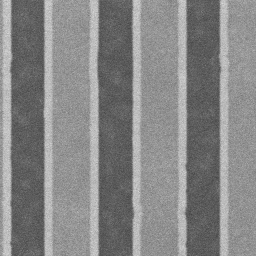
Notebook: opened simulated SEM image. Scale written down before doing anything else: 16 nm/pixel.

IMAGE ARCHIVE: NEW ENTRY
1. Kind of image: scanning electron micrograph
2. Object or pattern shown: one or a few lines or trenches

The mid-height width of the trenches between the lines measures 0.653 micrometres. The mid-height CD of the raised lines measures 0.745 µm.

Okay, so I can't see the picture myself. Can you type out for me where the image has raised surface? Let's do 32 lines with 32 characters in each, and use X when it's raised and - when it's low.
X-----XXXXXX-----XXXXXX-----XXXX
X-----XXXXXX-----XXXXXX-----XXXX
X-----XXXXXX-----XXXXXX-----XXXX
X-----XXXXXX-----XXXXXX-----XXXX
X-----XXXXXX-----XXXXXX-----XXXX
X-----XXXXXX-----XXXXXX-----XXXX
X-----XXXXXX-----XXXXXX-----XXXX
X-----XXXXXX-----XXXXXX-----XXXX
X-----XXXXXX-----XXXXXX-----XXXX
X-----XXXXXX-----XXXXXX-----XXXX
X-----XXXXXX-----XXXXXX-----XXXX
X-----XXXXXX-----XXXXXX-----XXXX
X-----XXXXXX-----XXXXXX-----XXXX
X-----XXXXXX-----XXXXXX-----XXXX
X-----XXXXXX-----XXXXXX-----XXXX
X-----XXXXXX-----XXXXXX-----XXXX
X-----XXXXXX-----XXXXXX-----XXXX
X-----XXXXXX-----XXXXXX-----XXXX
X-----XXXXXX-----XXXXXX-----XXXX
X-----XXXXXX-----XXXXXX-----XXXX
X-----XXXXXX-----XXXXXX-----XXXX
X-----XXXXXX-----XXXXXX-----XXXX
X-----XXXXXX-----XXXXXX-----XXXX
X-----XXXXXX-----XXXXXX-----XXXX
X-----XXXXXX-----XXXXXX-----XXXX
X-----XXXXXX-----XXXXXX-----XXXX
X-----XXXXXX-----XXXXXX-----XXXX
X-----XXXXXX-----XXXXXX-----XXXX
X-----XXXXXX-----XXXXXX-----XXXX
X-----XXXXXX-----XXXXXX-----XXXX
X-----XXXXXX-----XXXXXX-----XXXX
X-----XXXXXX-----XXXXXX-----XXXX